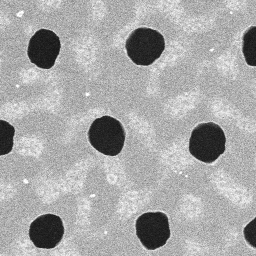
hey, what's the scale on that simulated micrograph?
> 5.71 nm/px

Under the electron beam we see holes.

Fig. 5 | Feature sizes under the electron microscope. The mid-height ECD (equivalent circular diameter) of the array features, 211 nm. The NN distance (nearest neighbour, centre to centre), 576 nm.